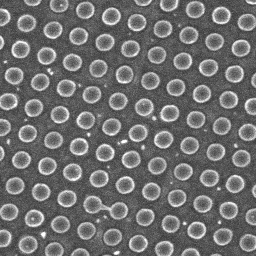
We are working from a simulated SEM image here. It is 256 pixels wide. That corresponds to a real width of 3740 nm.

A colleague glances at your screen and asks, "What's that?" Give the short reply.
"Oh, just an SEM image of a regular array of raised bodies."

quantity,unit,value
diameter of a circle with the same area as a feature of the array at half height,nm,250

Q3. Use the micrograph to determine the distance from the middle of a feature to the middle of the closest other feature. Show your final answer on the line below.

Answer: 386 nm